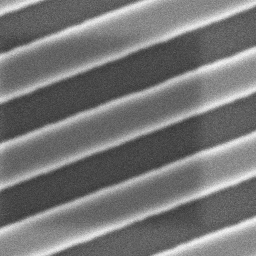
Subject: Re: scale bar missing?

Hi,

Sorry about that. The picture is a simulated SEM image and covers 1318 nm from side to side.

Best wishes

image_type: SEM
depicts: lines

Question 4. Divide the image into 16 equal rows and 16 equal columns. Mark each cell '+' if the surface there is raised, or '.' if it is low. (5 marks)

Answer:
+.......++++++++
.....++++++++...
..++++++++......
++++++++.......+
+++++.......++++
++........++++++
.......+++++++..
....+++++++.....
.++++++++......+
++++++.......+++
+++.......++++++
+......++++++++.
.....+++++++....
..+++++++.......
+++++++.......++
++++.......+++++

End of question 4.